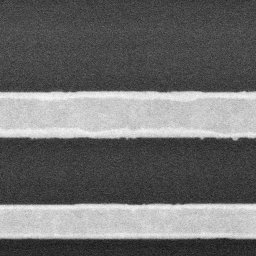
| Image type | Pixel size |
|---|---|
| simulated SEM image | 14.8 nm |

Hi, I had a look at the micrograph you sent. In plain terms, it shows lines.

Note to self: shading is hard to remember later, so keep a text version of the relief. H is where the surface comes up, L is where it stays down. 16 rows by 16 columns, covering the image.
LLLLLLLLLLLLLLLL
LLLLLLLLLLLLLLLL
LLLLLLLLLLLLLLLL
LLLLLLLLLLLLLLLL
LLLLLLLLLLLLLLLL
LLLLLLLLLLLLLLLL
HHHHHHHHHHHHHHHH
HHHHHHHHHHHHHHHH
LLLLLLLLLLLLLHHH
LLLLLLLLLLLLLLLL
LLLLLLLLLLLLLLLL
LLLLLLLLLLLLLLLL
LLLLLLLLLLLLLLLL
HHHHHHHHHHHHHHHH
HHHHHHHHHHHHHHHH
LLLLLLLLLLLLLLLL